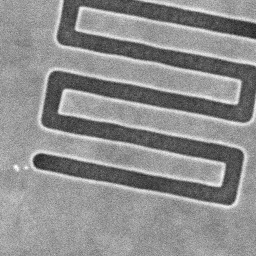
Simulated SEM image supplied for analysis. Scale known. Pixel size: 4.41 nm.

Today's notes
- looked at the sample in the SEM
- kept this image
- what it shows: groups of lines, slits or small figures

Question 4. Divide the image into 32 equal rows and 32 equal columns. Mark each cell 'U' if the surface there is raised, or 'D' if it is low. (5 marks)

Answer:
UUUUUUUUDDDDDDDDDDDDUUUUUUUUUUUU
UUUUUUUUDDUUUUDDDDDDDDDDDUUUUUUU
UUUUUUUDDDUUUUUUUUUDDDDDDDDDDDUU
UUUUUUUDDDUUUUUUUUUUUUUUDDDDDDDD
UUUUUUUDDDDDDUUUUUUUUUUUUUUUUDDD
UUUUUUUUDDDDDDDDDDUUUUUUUUUUUUUU
UUUUUUUUUUUUDDDDDDDDDDDUUUUUUUUU
UUUUUUUUUUUUUUUUUDDDDDDDDDDDUUUU
UUUUUUUUUUUUUUUUUUUUUUDDDDDDDDDD
UUUUUUDDDDDUUUUUUUUUUUUUUUUDDDDD
UUUUUUDDDDDDDDDDUUUUUUUUUUUUUUDD
UUUUUUDDUUDDDDDDDDDDDUUUUUUUUUDD
UUUUUUDDUUUUUUUDDDDDDDDDDDDUUUDD
UUUUUDDUUUUUUUUUUUUUDDDDDDDDDDDD
UUUUUDDDDUUUUUUUUUUUUUUUUUDDDDDD
UUUUUDDDDDDDDDDUUUUUUUUUUUUUUUUU
UUUUUUUUDDDDDDDDDDDDUUUUUUUUUUUU
UUUUUUUUUUUUUUDDDDDDDDDDDUUUUUUU
UUUUUUUUUUUUUUUUUUDDDDDDDDDDDDUU
UUUUDDDDUUUUUUUUUUUUUUUDDDDDDDDU
UUUUDDDDDDDDUUUUUUUUUUUUUUUUDDUU
UUUUUUDDDDDDDDDDDUUUUUUUUUUUDDUU
UUUUUUUUUUUDDDDDDDDDDDDUUUUUDDUU
UUUUUUUUUUUUUUUUDDDDDDDDDDDDDDUU
UUUUUUUUUUUUUUUUUUUUUUDDDDDDDDUU
UUUUUUUUUUUUUUUUUUUUUUUUUUUDDUUU
UUUUUUUUUUUUUUUUUUUUUUUUUUUUUUUU
UUUUUUUUUUUUUUUUUUUUUUUUUUUUUUUU
UUUUUUUUUUUUUUUUUUUUUUUUUUUUUUUU
UUUUUUUUUUUUUUUUUUUUUUUUUUUUUUUU
UUUUUUUUUUUUUUUUUUUUUUUUUUUUUUUU
UUUUUUUUUUUUUUUUUUUUUUUUUUUUUUUU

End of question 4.